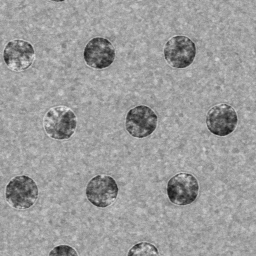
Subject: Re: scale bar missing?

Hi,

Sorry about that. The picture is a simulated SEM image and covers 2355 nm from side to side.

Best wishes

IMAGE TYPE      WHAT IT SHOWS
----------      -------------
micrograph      a regular array of holes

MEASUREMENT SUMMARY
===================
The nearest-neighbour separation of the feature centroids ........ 0.731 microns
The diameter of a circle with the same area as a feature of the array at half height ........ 0.296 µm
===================